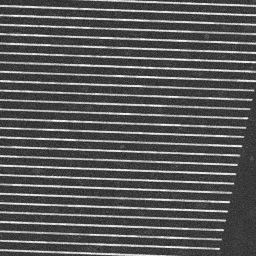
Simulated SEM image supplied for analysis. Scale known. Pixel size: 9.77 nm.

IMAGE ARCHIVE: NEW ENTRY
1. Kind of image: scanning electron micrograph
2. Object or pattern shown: parallel lines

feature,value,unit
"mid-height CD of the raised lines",0.0146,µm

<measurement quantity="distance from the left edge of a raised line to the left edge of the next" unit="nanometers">91.7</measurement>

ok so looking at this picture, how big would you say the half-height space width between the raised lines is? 76.9 nanometres